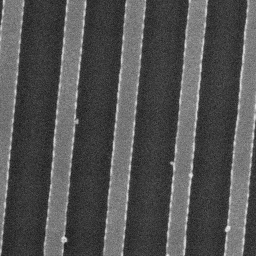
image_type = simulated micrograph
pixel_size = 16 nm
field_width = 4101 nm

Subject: lines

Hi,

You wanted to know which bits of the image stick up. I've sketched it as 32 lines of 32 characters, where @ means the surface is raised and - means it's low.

@@@-----@@@-----@@------@@-----@
@@@-----@@@-----@@------@@-----@
@@@-----@@------@@-----@@@-----@
@@@-----@@------@@-----@@@-----@
@@@-----@@-----@@@-----@@@-----@
@@@-----@@-----@@@-----@@-----@@
@@------@@-----@@@-----@@-----@@
@@------@@-----@@@-----@@-----@@
@@------@@-----@@------@@-----@@
@@------@@-----@@------@@-----@@
@@-----@@@-----@@------@@-----@@
@@-----@@@-----@@------@@-----@@
@@-----@@@-----@@------@@-----@@
@@-----@@------@@------@@-----@@
@@-----@@------@@-----@@@-----@@
@@-----@@-----@@@-----@@------@@
@@-----@@-----@@@-----@@------@@
@------@@-----@@@-----@@-----@@@
@------@@-----@@------@@-----@@@
@------@@-----@@------@@-----@@-
@------@@-----@@------@@-----@@-
@-----@@@-----@@------@@-----@@-
@-----@@@-----@@------@@-----@@-
@-----@@@-----@@------@@-----@@-
@-----@@@-----@@-----@@@-----@@-
@-----@@------@@-----@@@-----@@-
@-----@@-----@@@-----@@------@@-
------@@-----@@@-----@@------@@-
------@@-----@@@-----@@-----@@@-
------@@-----@@@-----@@-----@@@-
------@@-----@@------@@-----@@--
------@@-----@@------@@-----@@--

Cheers